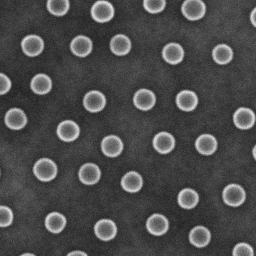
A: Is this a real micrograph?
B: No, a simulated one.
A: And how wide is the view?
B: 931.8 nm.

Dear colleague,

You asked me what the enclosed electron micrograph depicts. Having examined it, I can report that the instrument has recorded a regular array of raised bodies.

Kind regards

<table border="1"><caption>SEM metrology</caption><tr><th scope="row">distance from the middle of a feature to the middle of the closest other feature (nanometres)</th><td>150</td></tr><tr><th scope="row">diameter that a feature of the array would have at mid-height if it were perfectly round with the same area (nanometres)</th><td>73.3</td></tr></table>